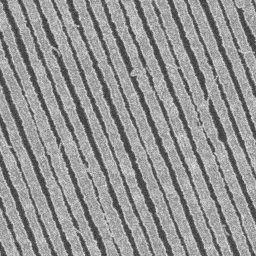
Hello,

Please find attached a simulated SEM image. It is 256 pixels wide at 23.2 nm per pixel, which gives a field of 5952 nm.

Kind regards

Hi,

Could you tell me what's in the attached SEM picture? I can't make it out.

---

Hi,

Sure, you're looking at parallel lines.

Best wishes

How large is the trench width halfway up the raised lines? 146 nanometres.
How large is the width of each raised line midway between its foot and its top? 211 nm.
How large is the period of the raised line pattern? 358 nanometers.